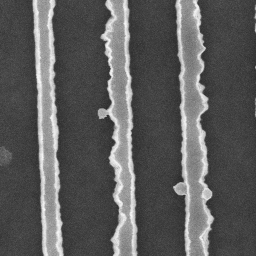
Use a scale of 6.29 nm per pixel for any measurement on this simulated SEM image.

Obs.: one or a few lines or trenches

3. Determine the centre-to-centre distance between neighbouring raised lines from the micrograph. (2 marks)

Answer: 0.457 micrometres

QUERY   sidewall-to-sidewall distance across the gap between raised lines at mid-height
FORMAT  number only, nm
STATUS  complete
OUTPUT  341